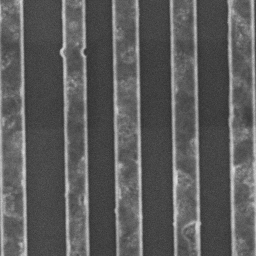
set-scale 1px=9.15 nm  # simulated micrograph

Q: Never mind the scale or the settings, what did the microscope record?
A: parallel lines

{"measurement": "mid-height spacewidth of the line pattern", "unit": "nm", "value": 302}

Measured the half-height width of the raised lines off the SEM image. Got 223 nm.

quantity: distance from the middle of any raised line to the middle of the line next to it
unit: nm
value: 514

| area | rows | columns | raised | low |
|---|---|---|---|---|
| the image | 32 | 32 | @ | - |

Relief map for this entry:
@@@-----@@----@@@----@@@-----@@@
@@@-----@@@---@@@----@@@-----@@@
@@@-----@@@---@@@----@@@-----@@@
@@@-----@@@---@@@----@@@-----@@@
@@@-----@@@---@@@-----@@-----@@@
@@@-----@@@---@@@-----@@-----@@@
@@@-----@@----@@@-----@@-----@@@
@@@-----@@@---@@@-----@@-----@@@
@@@-----@@@---@@@-----@@@----@@@
@@@-----@@@---@@@-----@@@----@@@
@@@-----@@@---@@@-----@@@----@@@
@@@-----@@@---@@@-----@@@----@@@
@@@-----@@@---@@@-----@@@----@@@
@@@-----@@@---@@@-----@@@----@@@
@@@-----@@@---@@@-----@@@----@@@
@@@-----@@@---@@@-----@@@----@@@
@@@-----@@@---@@@-----@@@----@@@
@@@-----@@@---@@@-----@@@----@@@
@@@-----@@@---@@@@----@@@----@@@
@@@-----@@@---@@@@----@@@----@@@
@@@-----@@@----@@@----@@@----@@@
@@@-----@@@----@@@----@@@----@@@
@@@-----@@@----@@@----@@@----@@@
@@@-----@@@----@@@----@@@----@@@
@@@-----@@@----@@@----@@@----@@@
@@@-----@@@----@@@----@@@----@@@
@@@-----@@@----@@@----@@@----@@@
@@@-----@@@----@@@----@@@----@@@
@@@-----@@@----@@@----@@@----@@@
@@@-----@@@----@@@----@@@----@@@
@@@-----@@@----@@@----@@@----@@@
@@@-----@@@----@@@----@@@----@@@